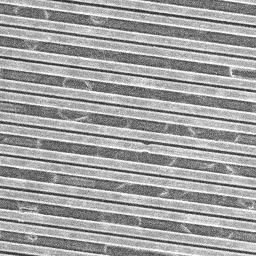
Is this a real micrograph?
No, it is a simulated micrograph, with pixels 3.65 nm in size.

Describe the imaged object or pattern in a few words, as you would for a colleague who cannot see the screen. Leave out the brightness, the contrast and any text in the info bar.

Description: parallel lines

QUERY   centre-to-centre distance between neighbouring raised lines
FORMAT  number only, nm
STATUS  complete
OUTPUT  58.5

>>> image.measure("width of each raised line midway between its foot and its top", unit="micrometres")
0.0312